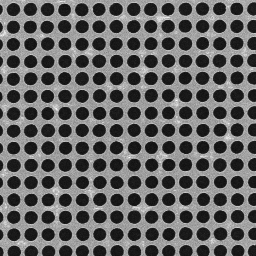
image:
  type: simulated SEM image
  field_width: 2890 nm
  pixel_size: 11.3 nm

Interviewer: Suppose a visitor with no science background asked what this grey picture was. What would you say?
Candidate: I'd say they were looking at a regular array of holes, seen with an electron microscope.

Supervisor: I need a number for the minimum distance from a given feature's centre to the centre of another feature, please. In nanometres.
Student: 189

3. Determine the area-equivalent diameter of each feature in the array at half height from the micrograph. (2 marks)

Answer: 150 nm